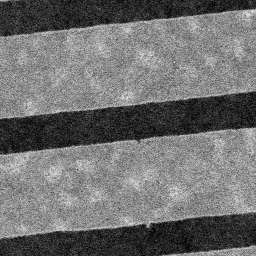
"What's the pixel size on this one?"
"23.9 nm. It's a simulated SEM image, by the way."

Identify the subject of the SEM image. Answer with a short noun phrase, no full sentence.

one or a few lines or trenches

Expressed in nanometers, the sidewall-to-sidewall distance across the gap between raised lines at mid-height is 860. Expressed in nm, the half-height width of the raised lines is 1950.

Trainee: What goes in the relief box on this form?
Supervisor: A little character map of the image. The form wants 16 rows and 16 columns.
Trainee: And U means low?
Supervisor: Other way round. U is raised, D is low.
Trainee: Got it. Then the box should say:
DDDDDDDDDDDDDDDD
DDDDDDDDUUUUUUUU
UUUUUUUUUUUUUUUU
UUUUUUUUUUUUUUUU
UUUUUUUUUUUUUUUU
UUUUUUUUUUUUUUUU
UUUUUUUUUDDDDDDD
DDDDDDDDDDDDDDDD
DDDDDDDDDDDUUUUU
DDUUUUUUUUUUUUUU
UUUUUUUUUUUUUUUU
UUUUUUUUUUUUUUUU
UUUUUUUUUUUUUUUU
UUUUUUUUUUUUUDDD
UUUDDDDDDDDDDDDD
DDDDDDDDDDDDDDDU